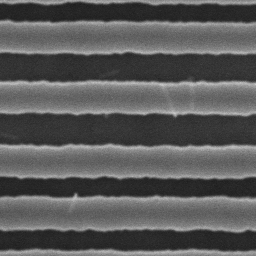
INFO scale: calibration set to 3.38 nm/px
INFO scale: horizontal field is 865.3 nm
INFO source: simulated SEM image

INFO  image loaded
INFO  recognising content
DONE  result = lines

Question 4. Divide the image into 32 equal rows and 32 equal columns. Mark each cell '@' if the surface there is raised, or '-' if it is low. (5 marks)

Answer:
-----@@------------@-@-@@--@@@@@
--------------------------------
--------------------------------
@@@@@@@@@@@@@@@@@@@@@@@@@@@@@@@@
@@@@@@@@@@@@@@@@@@@@@@@@@@@@@@@@
@@@@@@@@@@@@@@@@@@@@@@@@@@@@@@@@
-@@@@@@@@@@@@@@@@@@@@@@@@@@@@@@@
--------------------------------
--------------------------------
--------------------------------
@@@@@@@@@@@@@@@@@@@@@@@@@@@@@@@@
@@@@@@@@@@@@@@@@@@@@@@@@@@@@@@@@
@@@@@@@@@@@@@@@@@@@@@@@@@@@@@@@@
@@@@@@@@@@@@@@@@@@@@@@@@@@@@@@@@
--------------------------------
--------------------------------
--------------------------------
--------------------------------
@@@@@@@@@@@@@@@@@@@@@@@@@@@@@@@@
@@@@@@@@@@@@@@@@@@@@@@@@@@@@@@@@
@@@@@@@@@@@@@@@@@@@@@@@@@@@@@@@@
@@@@@@@@@@@@@@@@@@@@@@@@@@@@@@@@
--------------------------------
--------------------------------
--------------------------------
@@@@@@@@@@@@@@@@@@@@@@@@@@@@@@@@
@@@@@@@@@@@@@@@@@@@@@@@@@@@@@@@@
@@@@@@@@@@@@@@@@@@@@@@@@@@@@@@@@
@@@@@@@@@@@@@@@@@@@@@@@@@@@@@@@@
--------------------------------
--------------------------------
@@@@@@@@@@@@@@@@@@@@@@@@@@@@@@@@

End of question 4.